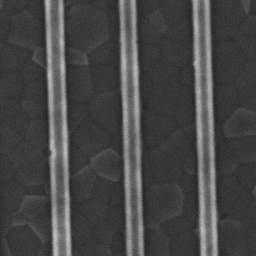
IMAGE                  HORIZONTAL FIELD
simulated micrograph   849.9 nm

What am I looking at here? one or a few lines or trenches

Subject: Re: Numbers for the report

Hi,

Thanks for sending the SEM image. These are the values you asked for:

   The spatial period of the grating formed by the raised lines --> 0.244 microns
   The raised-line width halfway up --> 39.8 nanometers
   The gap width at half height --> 203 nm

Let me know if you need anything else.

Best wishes